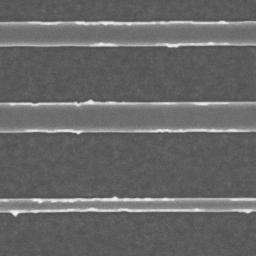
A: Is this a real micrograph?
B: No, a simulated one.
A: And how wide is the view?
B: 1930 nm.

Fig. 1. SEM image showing one or a few lines or trenches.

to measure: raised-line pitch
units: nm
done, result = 646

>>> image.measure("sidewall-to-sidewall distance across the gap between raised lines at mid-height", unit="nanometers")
459